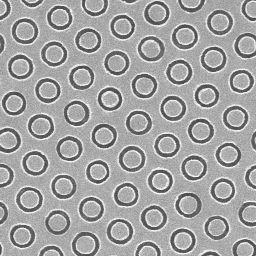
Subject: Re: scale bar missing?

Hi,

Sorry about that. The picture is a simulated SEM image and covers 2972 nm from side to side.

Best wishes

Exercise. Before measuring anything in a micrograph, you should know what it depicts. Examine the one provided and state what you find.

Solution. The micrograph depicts a regular array of ring-shaped grooves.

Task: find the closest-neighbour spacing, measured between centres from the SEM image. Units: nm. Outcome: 415